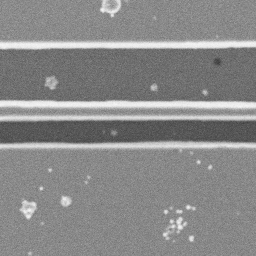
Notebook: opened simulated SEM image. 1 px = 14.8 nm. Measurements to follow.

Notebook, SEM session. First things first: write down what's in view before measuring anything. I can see lines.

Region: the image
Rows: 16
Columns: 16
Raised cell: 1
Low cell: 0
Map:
1111111111111111
1111111111111111
1111111111111111
0000000000000000
0000000000000000
0000000000000000
0000000000000000
0000000000000000
0000000000000000
1111111111111111
1111111111111111
1111111111111111
1111111111111111
1111111111111111
1111111111111111
1111111111111111